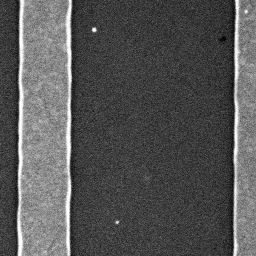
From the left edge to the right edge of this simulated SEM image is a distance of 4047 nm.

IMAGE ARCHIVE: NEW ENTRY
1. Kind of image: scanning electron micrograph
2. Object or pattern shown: wiring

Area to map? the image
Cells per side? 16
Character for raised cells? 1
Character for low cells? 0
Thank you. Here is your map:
0111000000000001
0111000000000001
0111000000000001
0111000000000001
0111000000000001
0111000000000001
0111000000000001
0111000000000001
0111000000000001
0111000000000001
0111000000000001
0111000000000001
0111000000000001
0111000000000001
0111000000000001
0111000000000001